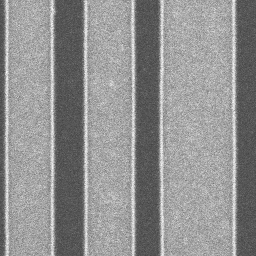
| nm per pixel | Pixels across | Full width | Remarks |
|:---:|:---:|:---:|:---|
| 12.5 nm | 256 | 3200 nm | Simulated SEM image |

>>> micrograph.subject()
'one or a few lines or trenches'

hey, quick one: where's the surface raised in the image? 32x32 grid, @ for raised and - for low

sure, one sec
@------@@@@------@@@---------@@@
@------@@@@------@@@---------@@@
@------@@@@------@@@---------@@@
@------@@@@------@@@---------@@@
@------@@@@------@@@---------@@@
@------@@@@------@@@---------@@@
@------@@@@------@@@---------@@@
@------@@@@------@@@---------@@@
@------@@@@------@@@---------@@@
@------@@@@------@@@---------@@@
@------@@@@------@@@---------@@@
@------@@@@------@@@---------@@@
@------@@@@------@@@---------@@@
@------@@@@------@@@---------@@@
@------@@@@------@@@---------@@@
@------@@@@------@@@---------@@@
@------@@@@------@@@---------@@@
@------@@@@------@@@---------@@@
@------@@@@------@@@---------@@@
@------@@@@------@@@---------@@@
@------@@@@------@@@---------@@@
@------@@@@------@@@---------@@@
@------@@@@------@@@---------@@@
@------@@@@------@@@---------@@@
@------@@@@------@@@---------@@@
@------@@@@------@@@---------@@@
@------@@@@------@@@---------@@@
@------@@@@------@@@---------@@@
@------@@@@------@@@---------@@@
@------@@@@------@@@---------@@@
@------@@@@------@@@---------@@@
@------@@@@------@@@---------@@@